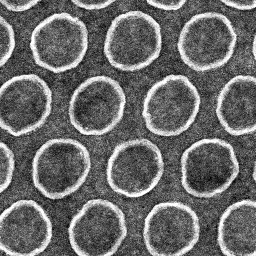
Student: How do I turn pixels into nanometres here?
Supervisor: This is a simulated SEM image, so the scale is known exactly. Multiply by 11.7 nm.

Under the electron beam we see a regular array of raised bodies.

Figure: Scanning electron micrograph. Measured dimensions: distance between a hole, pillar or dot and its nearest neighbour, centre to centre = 848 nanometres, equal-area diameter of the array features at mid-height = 626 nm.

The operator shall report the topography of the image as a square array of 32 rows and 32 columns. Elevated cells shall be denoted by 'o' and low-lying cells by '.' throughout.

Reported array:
.ooo......ooo......oooo......ooo
................................
......ooo......oooo.....oooo....
o....ooooo....oooooo...oooooo...
o...ooooooo...oooooo...oooooo...
o...ooooooo..ooooooo...oooooo...
o...oooooo...ooooooo...oooooo...
o....ooooo....ooooo....ooooo....
......oo........................
................................
.oooo......ooo......oooo.....ooo
oooooo....ooooo....ooooo....oooo
oooooo...oooooo...ooooooo...oooo
oooooo...oooooo...ooooooo..ooooo
oooooo...oooooo...oooooo...ooooo
ooooo....ooooo.....oooo.....oooo
..o.......ooo.......oo.......o..
................................
o....ooooo.....oooo.....ooooo...
o....oooooo...oooooo...oooooo...
o...ooooooo...oooooo...ooooooo..
o...ooooooo...oooooo...oooooo...
o...oooooo....oooooo...oooooo...
.....oooo.....ooooo....ooooo....
................................
..oo.......ooo................oo
.oooo.....ooooo....ooooo.....ooo
oooooo...oooooo...oooooo....oooo
oooooo...oooooo...ooooooo...oooo
oooooo...oooooo...ooooooo...oooo
oooooo...oooooo....ooooo....oooo
.oooo.....oooo.....oooo.....oooo